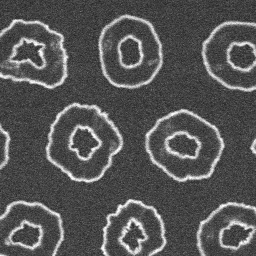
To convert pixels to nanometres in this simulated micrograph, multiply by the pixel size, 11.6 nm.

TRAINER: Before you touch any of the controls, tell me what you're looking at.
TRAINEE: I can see ring-shaped raised bodies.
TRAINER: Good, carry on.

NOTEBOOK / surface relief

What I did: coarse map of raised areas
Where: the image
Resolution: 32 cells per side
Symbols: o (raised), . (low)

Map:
................................
................................
...............ooo..............
.ooooo.......oooooo........ooooo
oooooooo.....oooooo.......oooooo
ooo.oooo.....oo..ooo......oooooo
oo...ooo.....oo..ooo.....oooo...
oo...ooo.....oo..ooo......ooo...
oooooooo.....ooooooo......oooo.o
oooooooo.....oooooo........ooooo
.....oo.......oooo..........oooo
................................
................................
........oooo....................
.......oooooo........oooo.......
.......ooooooo......oooooo......
o.....ooo..oooo....oooooooo.....
o.....ooo...ooo...ooo...oooo....
o.....ooo...ooo...ooo....ooo....
o.....oooo.ooo.....oooooooo.....
.......ooooooo.....oooooooo.....
........ooooo........ooooo......
.........ooo....................
................................
................................
.ooo............oo..........oo..
.oooooo........ooooo.......ooooo
oooooooo......oooooo......oooooo
ooo..ooo.....ooo..oo.....ooo...o
o....ooo.....oo...oo.....ooo...o
ooo..oo......ooo.oooo....ooo..oo
ooooooo......oooooo......ooooooo